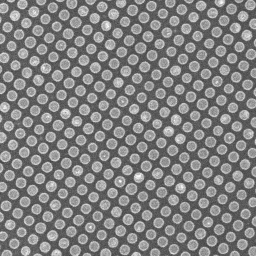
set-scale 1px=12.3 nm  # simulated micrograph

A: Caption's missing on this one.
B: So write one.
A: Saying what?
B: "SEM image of a regular array of raised bodies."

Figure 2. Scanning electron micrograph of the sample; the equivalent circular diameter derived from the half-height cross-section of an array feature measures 123 nanometers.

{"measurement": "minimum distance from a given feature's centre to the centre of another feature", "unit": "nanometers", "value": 166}